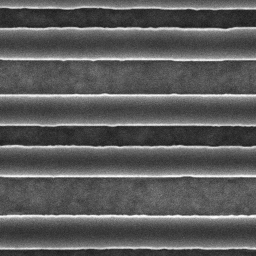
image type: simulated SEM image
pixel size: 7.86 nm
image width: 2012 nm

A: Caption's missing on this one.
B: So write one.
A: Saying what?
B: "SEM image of lines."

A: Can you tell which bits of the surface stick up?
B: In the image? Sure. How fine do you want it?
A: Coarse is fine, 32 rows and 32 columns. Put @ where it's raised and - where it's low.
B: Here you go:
@@@@@@@@@@@@@@@@@@@@@@@@@@@@@@@@
--------------------------------
--------------------------------
--@---@@@@-@@-@-@@-@@@@------@@@
@@@@@@@@@@@@@@@@@@@@@@@@@@@@@@@@
@@@@@@@@@@@@@@@@@@@@@@@@@@@@@@@@
@@@@@@@@@@@@@@@@@@@@@@@@@@@@@@@@
-----------@---------@@@@@@@----
--------------------------------
--------------------------------
--------------------------------
--------------------------------
@@@@@@@@@@@@@@@@@@@@@@@@@@@@@@@@
@@@@@@@@@@@@@@@@@@@@@@@@@@@@@@@@
@@@@@@@@@@@@@@@@@@@@@@@@@@@@@@@@
@@@@@@@@@@@@@@@@@@@@@@@@@@@@@@@@
--------------------------------
--------------------------------
@@@@@@@@@@@@@@@@@@@@@@@@@@@@@@@@
@@@@@@@@@@@@@@@@@@@@@@@@@@@@@@@@
@@@@@@@@@@@@@@@@@@@@@@@@@@@@@@@@
@@@@@@@@@@@@@@@@@@@@@@@@@@@@@@@@
--------------------------------
--------------------------------
--------------------------------
--------------------------------
--------------------------------
@@@@@@@@@@@@@@@@@@@@@@@@@@@@@@@@
@@@@@@@@@@@@@@@@@@@@@@@@@@@@@@@@
@@@@@@@@@@@@@@@@@@@@@@@@@@@@@@@@
@@@@@@@@@@@@@@@@@@@@@@@@@@@@@@@@
--------------------------------